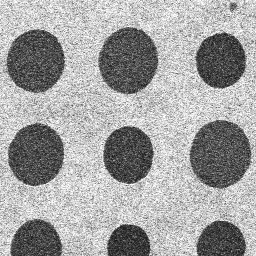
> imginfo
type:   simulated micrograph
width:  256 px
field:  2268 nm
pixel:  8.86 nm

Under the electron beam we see holes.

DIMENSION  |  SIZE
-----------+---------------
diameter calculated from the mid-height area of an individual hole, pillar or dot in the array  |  530 nanometres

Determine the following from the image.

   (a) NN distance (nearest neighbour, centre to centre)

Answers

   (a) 819 nanometers